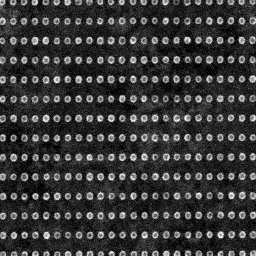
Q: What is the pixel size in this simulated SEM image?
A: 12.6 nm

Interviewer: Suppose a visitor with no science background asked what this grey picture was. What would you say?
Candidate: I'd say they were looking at a regular array of raised bodies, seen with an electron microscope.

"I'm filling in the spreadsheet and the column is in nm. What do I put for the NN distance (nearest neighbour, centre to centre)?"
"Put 135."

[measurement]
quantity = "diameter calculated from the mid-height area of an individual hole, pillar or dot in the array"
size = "0.0723 micrometres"